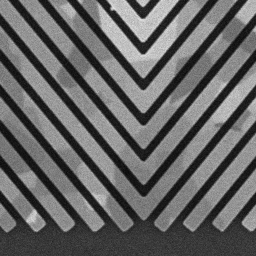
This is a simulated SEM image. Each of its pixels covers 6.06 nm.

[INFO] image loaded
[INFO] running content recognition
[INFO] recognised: groups of lines, slits or small figures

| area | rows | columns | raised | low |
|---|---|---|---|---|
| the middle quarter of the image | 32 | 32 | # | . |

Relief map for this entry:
..#####...####...######..#####..
#..#####..#####...####..#####...
#...#####..#####...##...####...#
##...#####..#####......####...##
###...####...#####....####...###
####...####...#####..#####..####
#####..#####...####.#####...####
.####...#####..#########...####.
..####...#####..#######...#####.
...####...####...#####...#####..
#..#####...####...####..#####...
#...#####..#####...##...####...#
##...#####..#####......####...##
###...####...#####....####...###
####...####...#####..#####..####
#####...####...##########...####
.#####..#####...########...####.
..####...#####...######...#####.
...####...#####..#####...#####..
#..#####...####...####..#####...
##..#####...####...##..#####...#
##...#####..#####......####...##
###...#####..#####....####...###
####...####...#####..#####..####
#####...####...##########...####
.#####..#####...########...####.
..#####..#####...######...####..
...####...#####..#####...#####..
#...####...####...####..#####..#
##...####...####...##..#####...#
###..#####..#####......####...##
###...#####..#####....####...###